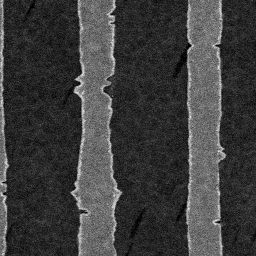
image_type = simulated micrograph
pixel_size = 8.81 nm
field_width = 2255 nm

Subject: one or a few lines or trenches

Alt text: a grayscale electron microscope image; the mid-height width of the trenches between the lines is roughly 655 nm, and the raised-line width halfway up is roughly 291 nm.